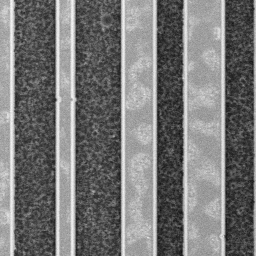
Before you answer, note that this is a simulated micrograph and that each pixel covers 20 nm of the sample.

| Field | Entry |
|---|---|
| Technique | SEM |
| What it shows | one or a few lines or trenches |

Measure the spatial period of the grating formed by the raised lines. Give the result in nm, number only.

1380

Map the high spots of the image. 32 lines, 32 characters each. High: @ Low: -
@------@@-------@@@----@@@@@----
@------@@-------@@@----@@@@@----
@------@@-------@@@----@@@@@----
@------@@-------@@@----@@@@@----
@------@@-------@@@----@@@@@----
@------@@-------@@@----@@@@@----
@------@@-------@@@----@@@@@----
@------@@-------@@@----@@@@@----
@------@@-------@@@----@@@@@----
@------@@-------@@@----@@@@@----
@------@@-------@@@----@@@@@----
@------@@-------@@@----@@@@@----
@------@@-------@@@----@@@@@----
@------@@-------@@@----@@@@@----
@------@@-------@@@----@@@@@----
@------@@-------@@@----@@@@@----
@------@@-------@@@----@@@@@----
@------@@-------@@@----@@@@@----
@------@@-------@@@----@@@@@----
@------@@-------@@@----@@@@@----
@------@@-------@@@----@@@@@----
@------@@-------@@@----@@@@@----
@------@@-------@@@----@@@@@----
@------@@-------@@@----@@@@@----
@------@@-------@@@----@@@@@----
@------@@-------@@@----@@@@@----
@------@@-------@@@----@@@@@----
@------@@-------@@@----@@@@@----
@------@@-------@@@----@@@@@----
@------@@-------@@@----@@@@@----
@------@@-------@@@----@@@@@----
@------@@-------@@@----@@@@@----